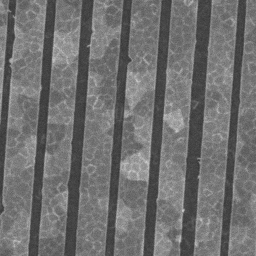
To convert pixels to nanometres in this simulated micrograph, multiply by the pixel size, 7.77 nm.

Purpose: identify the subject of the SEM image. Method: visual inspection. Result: parallel lines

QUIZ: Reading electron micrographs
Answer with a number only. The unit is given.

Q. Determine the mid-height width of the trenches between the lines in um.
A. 0.0794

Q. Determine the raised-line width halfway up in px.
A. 26.5